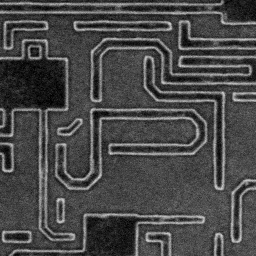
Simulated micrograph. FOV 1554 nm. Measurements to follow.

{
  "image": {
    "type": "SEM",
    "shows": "wiring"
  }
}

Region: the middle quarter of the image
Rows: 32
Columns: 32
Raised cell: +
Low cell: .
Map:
+......++...........++...++....+
+......++...........++...++.....
+......++...........++...++.....
+......++...........++...+++++++
+......++...........++...+++++++
+......++...........+++.........
+......++............+++........
+......++.............++++++++++
+......++.............++++++++++
+...............................
+...............................
.......+++++++++++++++++++++++++
.......+++++++++++++++++++++++++
.......+++++...+++++++++++++...+
..++...++.......................
.+++...++.......................
+++....++.......................
.......++.......................
.......++.......................
.......++.......................
.......++..+++++++++++++++++++++
.......++..+++++++++++++++++++++
.......++..........+++++++++++..
.......++.......................
.......++.......................
.......++.......................
.......++.......................
+.....+++.......................
++...++++.......................
++++++++........................
.++++++.........................
................................